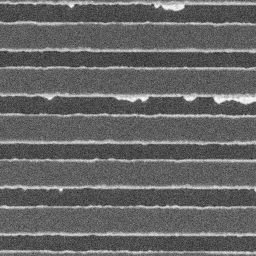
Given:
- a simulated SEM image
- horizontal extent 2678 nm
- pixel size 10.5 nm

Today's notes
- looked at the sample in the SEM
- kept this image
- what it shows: lines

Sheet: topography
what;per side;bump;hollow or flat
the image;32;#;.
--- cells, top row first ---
......##...####.....####..######
................................
................................
################################
################################
################################
................................
................................
##.#..###.#..#.#................
################################
################################
################################
...........................#..##
................................
############################....
################################
################################
################################
................................
................................
################################
################################
################################
...#####........#####..#.#######
................................
................................
################################
################################
################################
................................
................................
#######.#.####....#.............